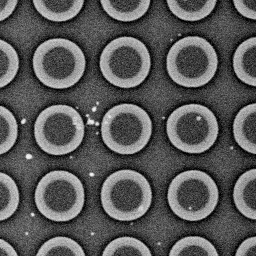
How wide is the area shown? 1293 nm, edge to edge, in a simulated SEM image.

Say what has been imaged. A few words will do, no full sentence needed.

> an array of small figures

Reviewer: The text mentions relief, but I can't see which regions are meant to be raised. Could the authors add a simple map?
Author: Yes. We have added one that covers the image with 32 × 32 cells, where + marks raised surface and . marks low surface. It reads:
++..++++++...++++++..++++++..+++
+....+++++...+++++....++++....++
......++.......++......++.......
................................
................................
+....++++.....++++....++++....++
++..++++++...+++++...++++++..+++
++..+++++++..++++++..++++++..+++
++..+++++++..++++++..++++++..+++
++...+++++...+++++...++++++...++
+.....+++.....+++.....++++.....+
................................
................................
+.....+++.....+++.....++++....++
++...+++++...+++++...++++++...++
++..++++++...++++++..++++++..+++
++..++++++...++++++..++++++..+++
++...+++++...+++++...++++++..+++
+....++++.....++++....++++....++
................................
................................
......++.......++......++......+
++...+++++...+++++....+++++...++
++...+++++...++++++..++++++..+++
++..++++++...++++++..++++++..+++
++...+++++...++++++..++++++..+++
++...+++++...+++++....++++....++
.......+.......+.......++.......
................................
................................
+.....++++....++++....++++....++
++...+++++...++++++..++++++...++